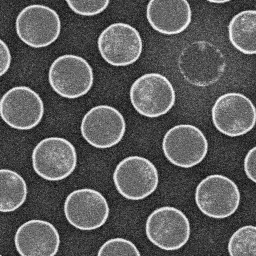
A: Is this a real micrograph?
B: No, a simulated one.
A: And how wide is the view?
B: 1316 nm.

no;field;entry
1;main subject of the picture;a regular array of raised bodies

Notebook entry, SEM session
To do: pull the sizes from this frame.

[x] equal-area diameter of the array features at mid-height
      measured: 219 nm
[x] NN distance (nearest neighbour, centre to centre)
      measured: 302 nanometers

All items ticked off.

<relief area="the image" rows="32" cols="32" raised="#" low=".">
.........####......####.........
...####...##......######......##
..#####............#####.....###
..#####.......###..####......###
..#####......####............###
....##......######...........###
#............#####.............#
#......###...####...............
#.....#####.....................
......#####.......##............
......#####......####...........
.###...####.....######..........
#####...........######.....####.
#####.......##...####......#####
#####......####....#.......#####
.####.....######...........#####
..........#####......####...###.
......##...####......#####......
.....####...........######......
....#####............#####.....#
....#####......####...##.......#
##...####.....######...........#
###...#.......######......###...
###............####......#####..
###......####...##.......#####..
###.....#####............#####..
........######.....###...####...
.........####......####.........
..#####...##......######......##
..#####............#####.....###
..#####......####..####......###
..#####.....#####............###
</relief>